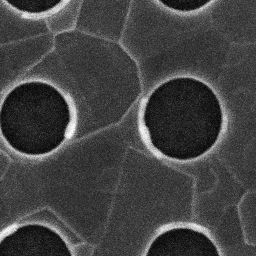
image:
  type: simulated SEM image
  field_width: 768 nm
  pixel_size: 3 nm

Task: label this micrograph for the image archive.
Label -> holes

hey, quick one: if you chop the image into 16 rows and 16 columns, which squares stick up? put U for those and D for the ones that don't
UDDUUUUUUUUDDUUU
UUUUUUUUUUUUUUUU
UUUUUUUUUUUUUUUU
UUUUUUUUUUUUUUUU
UUUUUUUUUUUUUUUU
UDDUUUUUUUDDDUUU
DDDDUUUUUDDDDDUU
DDDDUUUUUDDDDDUU
DDDDUUUUUDDDDDUU
UDDUUUUUUUDDDUUU
UUUUUUUUUUUUUUUU
UUUUUUUUUUUUUUUU
UUUUUUUUUUUUUUUU
UUUUUUUUUUUUUUUU
UDDDUUUUUUDDUUUU
DDDDUUUUUDDDDDUU